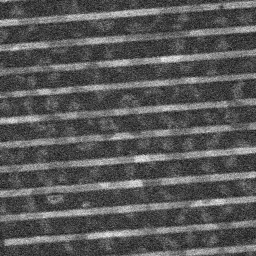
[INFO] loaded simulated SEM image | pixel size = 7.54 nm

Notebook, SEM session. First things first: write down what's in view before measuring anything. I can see parallel lines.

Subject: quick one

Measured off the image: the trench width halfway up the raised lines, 146 nanometres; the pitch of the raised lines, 24.3 px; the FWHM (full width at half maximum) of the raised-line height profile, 4.87 px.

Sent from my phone